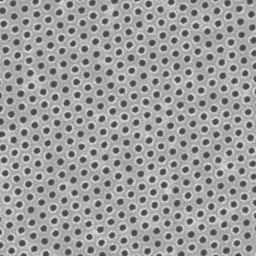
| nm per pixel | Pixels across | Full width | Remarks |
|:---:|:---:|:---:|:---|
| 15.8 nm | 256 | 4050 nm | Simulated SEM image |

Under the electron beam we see a regular array of holes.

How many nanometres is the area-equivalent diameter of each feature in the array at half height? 113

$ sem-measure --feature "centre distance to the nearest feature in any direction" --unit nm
201